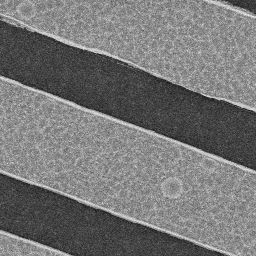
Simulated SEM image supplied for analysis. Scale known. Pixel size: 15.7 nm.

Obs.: one or a few lines or trenches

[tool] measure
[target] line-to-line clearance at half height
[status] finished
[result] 894 nanometres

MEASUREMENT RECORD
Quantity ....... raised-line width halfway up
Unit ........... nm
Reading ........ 1360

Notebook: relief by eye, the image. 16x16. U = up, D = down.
UUUUUUUUUUUUUUDD
DDUUUUUUUUUUUUUU
DDDDUUUUUUUUUUUU
DDDDDDDUUUUUUUUU
DDDDDDDDDUUUUUUU
UUDDDDDDDDDDUUUU
UUUUDDDDDDDDDDDU
UUUUUUUDDDDDDDDD
UUUUUUUUUUDDDDDD
UUUUUUUUUUUUUDDD
UUUUUUUUUUUUUUUD
DDUUUUUUUUUUUUUU
DDDDDUUUUUUUUUUU
DDDDDDDDUUUUUUUU
DDDDDDDDDDDUUUUU
UUUDDDDDDDDDDUUU